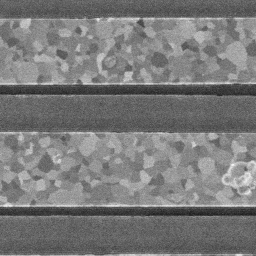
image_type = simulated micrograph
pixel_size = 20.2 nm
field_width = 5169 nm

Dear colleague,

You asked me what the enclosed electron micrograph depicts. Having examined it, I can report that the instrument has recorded lines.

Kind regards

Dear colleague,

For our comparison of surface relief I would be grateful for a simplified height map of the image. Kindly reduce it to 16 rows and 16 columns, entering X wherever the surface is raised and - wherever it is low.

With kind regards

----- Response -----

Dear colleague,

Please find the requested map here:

----------------
XXXXXXXXXXXXXXXX
XXXXXXXXXXXXXXXX
XXXXXXXXXXXXXXXX
XXXXXXXXXXXXXXXX
----------------
----------------
----------------
XXXXXXXXXXXXXXXX
XXXXXXXXXXXXXXXX
XXXXXXXXXXXXXXXX
XXXXXXXXXXXXXXXX
XXXXXXXXXXXXXXXX
----------------
----------------
----------------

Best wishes